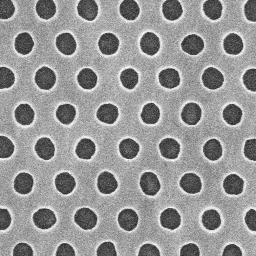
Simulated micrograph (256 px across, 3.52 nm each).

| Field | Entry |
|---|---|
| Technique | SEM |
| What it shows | a regular array of holes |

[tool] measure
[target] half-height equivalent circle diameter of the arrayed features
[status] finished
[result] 77.9 nm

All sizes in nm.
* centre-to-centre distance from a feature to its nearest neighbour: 142